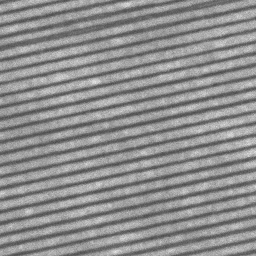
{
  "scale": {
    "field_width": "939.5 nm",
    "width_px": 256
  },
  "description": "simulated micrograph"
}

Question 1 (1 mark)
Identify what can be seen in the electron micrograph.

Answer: parallel lines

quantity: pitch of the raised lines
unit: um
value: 0.0418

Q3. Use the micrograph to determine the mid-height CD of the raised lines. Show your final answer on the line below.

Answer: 26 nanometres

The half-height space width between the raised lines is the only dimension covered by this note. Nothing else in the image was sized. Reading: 4.74 px